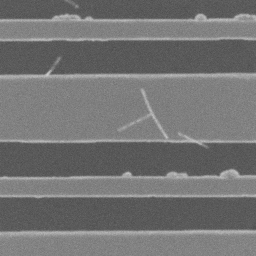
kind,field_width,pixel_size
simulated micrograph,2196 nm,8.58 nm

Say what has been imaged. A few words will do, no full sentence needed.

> lines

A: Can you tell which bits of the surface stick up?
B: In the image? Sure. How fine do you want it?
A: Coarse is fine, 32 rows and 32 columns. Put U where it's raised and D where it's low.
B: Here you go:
DDDDDDDDDDDDDDDDDDDDDDDDDDDDDDDD
DDDDDDDDDDDDDDDDDDDDDDDDDDDDDDDD
UUUUUUUUUUUUUUUUUUUUUUUUUUUUUUUU
UUUUUUUUUUUUUUUUUUUUUUUUUUUUUUUU
UUUUUUUUUUUUUUUUUUUUUUUUUUUUUUUU
DDDDDDDDDDDDDDDDDDDDDDDDDDDDDDDD
DDDDDDDDDDDDDDDDDDDDDDDDDDDDDDDD
DDDDDDDDDDDDDDDDDDDDDDDDDDDDDDDD
DDDDDDDDDDDDDDDDDDDDDDDDDDDDDDDD
DDDDDUUDDDDDUUUUUDDDUUUUUUUUUUUU
UUUUUUUUUUUUUUUUUUUUUUUUUUUUUUUU
UUUUUUUUUUUUUUUUUUUUUUUUUUUUUUUU
UUUUUUUUUUUUUUUUUUUUUUUUUUUUUUUU
UUUUUUUUUUUUUUUUUUUUUUUUUUUUUUUU
UUUUUUUUUUUUUUUUUUUUUUUUUUUUUUUU
UUUUUUUUUUUUUUUUUUUUUUUUUUUUUUUU
UUUUUUUUUUUUUUUUUUUUUUUUUUUUUUUU
UUUUUUUUUUUUUUUUUUUUUUUUUUUUUUUU
DDDDDDDDDDDDDDDDDDDDDDDDDDDDDDDD
DDDDDDDDDDDDDDDDDDDDDDDDDDDDDDDD
DDDDDDDDDDDDDDDDDDDDDDDDDDDDDDDD
DDDDDDDDDDDDDDDDDDDDDDDDDDDDUDDD
UUUUUUUUUUUUUUUUUUUUUUUUUUUUUUUU
UUUUUUUUUUUUUUUUUUUUUUUUUUUUUUUU
UUUUUUUUUUUUUUUUUUUUUUUUUUUUUUUU
DDDDDDDDDDDDDDDDDDDDDDDDDDDDDDDD
DDDDDDDDDDDDDDDDDDDDDDDDDDDDDDDD
DDDDDDDDDDDDDDDDDDDDDDDDDDDDDDDD
DDDDDDDDDDDDDDDDDDDDDDDDDDDDDDDD
UUUUUUUUUUUUUUUUUUUUUUUUUUUUUUUU
UUUUUUUUUUUUUUUUUUUUUUUUUUUUUUUU
UUUUUUUUUUUUUUUUUUUUUUUUUUUUUUUU